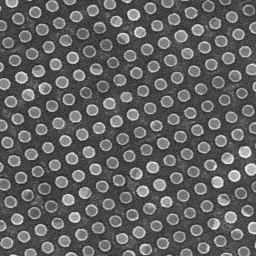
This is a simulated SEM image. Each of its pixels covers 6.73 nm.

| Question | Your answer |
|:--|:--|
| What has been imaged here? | a regular array of raised bodies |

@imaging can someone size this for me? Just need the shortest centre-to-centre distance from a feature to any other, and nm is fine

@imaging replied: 121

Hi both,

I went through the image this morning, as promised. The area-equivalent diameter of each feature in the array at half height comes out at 75.5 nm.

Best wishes